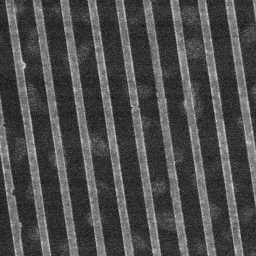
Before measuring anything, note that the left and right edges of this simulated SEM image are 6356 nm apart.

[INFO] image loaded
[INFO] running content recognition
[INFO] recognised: parallel lines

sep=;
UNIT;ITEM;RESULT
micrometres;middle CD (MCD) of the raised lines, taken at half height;0.181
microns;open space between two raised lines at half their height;0.497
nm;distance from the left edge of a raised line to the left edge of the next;675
